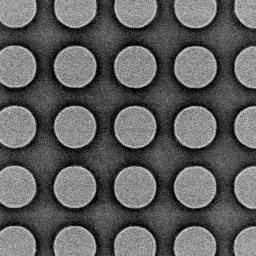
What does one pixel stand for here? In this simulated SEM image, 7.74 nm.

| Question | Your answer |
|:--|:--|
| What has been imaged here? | an array of small figures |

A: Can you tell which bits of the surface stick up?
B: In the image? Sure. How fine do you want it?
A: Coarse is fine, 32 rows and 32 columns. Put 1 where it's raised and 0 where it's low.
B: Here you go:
11110001111100111110001111100111
11110001111100111110001111100111
11110001111000011110001111000011
00000000000000000000000000000000
00000000000000000000000000000000
00000000000000000000000000000000
11110000111000011110000111000011
11110001111100111110001111100011
11110001111100111110001111100111
11110001111100011110001111100011
01100000111000011100000111000011
00000000000000000000000000000000
00000000000000000000000000000000
01100000110000001100000110000001
11110001111100011110001111100011
11110001111100111110001111100111
11110001111100111110001111100111
11110001111000011110001111000011
00000000000000000000000000000000
00000000000000000000000000000000
00000000000000000000000000000000
11110000111000011110000111000011
11110001111100111110001111100111
11110001111100111110001111100111
11110001111100011110001111100011
11100000111000011100000111000011
00000000000000000000000000000000
00000000000000000000000000000000
01100000110000001100000010000001
11110001111000011110001111100011
11110001111100111110001111100111
11110001111100111110001111100111